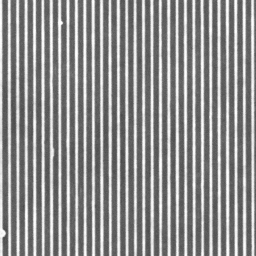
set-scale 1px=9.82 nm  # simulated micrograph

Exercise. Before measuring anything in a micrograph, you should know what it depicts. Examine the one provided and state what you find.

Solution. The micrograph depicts parallel lines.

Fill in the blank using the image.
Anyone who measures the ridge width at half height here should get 0.0245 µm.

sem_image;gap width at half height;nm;57.7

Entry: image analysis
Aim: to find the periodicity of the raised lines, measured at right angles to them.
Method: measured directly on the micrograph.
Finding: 82.4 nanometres